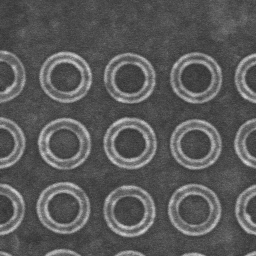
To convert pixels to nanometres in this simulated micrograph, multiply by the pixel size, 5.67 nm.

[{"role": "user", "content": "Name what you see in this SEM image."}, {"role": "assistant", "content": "a regular array of ring-shaped raised bodies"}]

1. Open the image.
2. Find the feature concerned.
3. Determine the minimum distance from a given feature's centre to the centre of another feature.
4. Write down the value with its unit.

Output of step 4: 0.368 microns